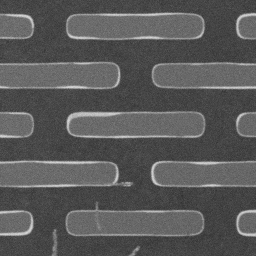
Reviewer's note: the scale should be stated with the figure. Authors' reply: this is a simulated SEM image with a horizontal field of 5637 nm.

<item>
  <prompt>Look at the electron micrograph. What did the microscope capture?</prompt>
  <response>groups of lines, slits or small figures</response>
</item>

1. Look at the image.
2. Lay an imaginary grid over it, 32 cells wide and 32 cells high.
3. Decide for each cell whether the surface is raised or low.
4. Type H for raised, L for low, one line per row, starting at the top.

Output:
LLLLLLLLLLLLLLLLLLLLLLLLLLLLLLLL
LLLLLLLLLLLLLLLLLLLLLLLLLLLLLLLL
HHHHLLLLLHHHHHHHHHHHHHHHHLLLLLHH
HHHHLLLLHHHHHHHHHHHHHHHHHLLLLLHH
HHHHLLLLLHHHHHHHHHHHHHHHHLLLLLHH
LLLLLLLLLLLLLLLLLLLLLLLLLLLLLLLL
LLLLLLLLLLLLLLLLLLLLLLLLLLLLLLLL
LLLLLLLLLLLLLLLLLLLLLLLLLLLLLLLL
HHHHHHHHHHHHHHHLLLLHHHHHHHHHHHHH
HHHHHHHHHHHHHHHLLLLHHHHHHHHHHHHH
HHHHHHHHHHHHHHHLLLLHHHHHHHHHHHHH
LLLLLLLLLLLLLLLLLLLLLLLLLLLLLLLL
LLLLLLLLLLLLLLLLLLLLLLLLLLLLLLLL
LLLLLLLLLLLLLLLLLLLLLLLLLLLLLLLL
HHHHLLLLLHHHHHHHHHHHHHHHHLLLLLHH
HHHHLLLLLHHHHHHHHHHHHHHHHLLLLLHH
HHHHLLLLLHHHHHHHHHHHHHHHHLLLLLHH
LLLLLLLLLLLLLLLLLLLLLLLLLLLLLLLL
LLLLLLLLLLLLLLLLLLLLLLLLLLLLLLLL
LLLLLLLLLLLLLLLLLLLLLLLLLLLLLLLL
HHHHHHHHHHHHHHLLLLLHHHHHHHHHHHHH
HHHHHHHHHHHHHHHLLLLHHHHHHHHHHHHH
HHHHHHHHHHHHHHHLLLLHHHHHHHHHHHHH
LLLLLLLLLLLLLLLLLLLLLLLLLLLLLLLL
LLLLLLLLLLLLLLLLLLLLLLLLLLLLLLLL
LLLLLLLLLLLLLLLLLLLLLLLLLLLLLLLL
LLLLLLLLLHHHHHLLLLLLHHHHHLLLLLLL
HHHHLLLLHHHHHHHHHHHHHHHHHLLLLLHH
HHHHLLLLHHHHHHHHHHHHHHHHHLLLLLHH
LLLLLLLLLLLLLLLLLLLLLLLLLLLLLLLL
LLLLLLLLLLLLLLLLLLLLLLLLLLLLLLLL
LLLLLLLLLLLLLLLLLLLLLLLLLLLLLLLL